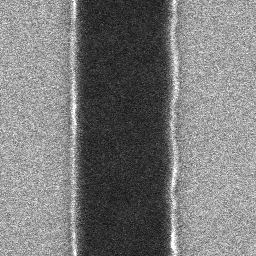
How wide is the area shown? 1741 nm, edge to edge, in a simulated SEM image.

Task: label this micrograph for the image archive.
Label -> one or a few lines or trenches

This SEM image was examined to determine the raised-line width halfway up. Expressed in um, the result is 0.708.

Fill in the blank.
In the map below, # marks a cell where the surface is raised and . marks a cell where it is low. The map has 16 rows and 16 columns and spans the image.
....#######.....
.....######.....
....#######.....
....#######.....
....#######.....
....#######.....
....#######.....
....#######.....
....#######.....
....#######.....
....#######.....
.....######.....
.....######.....
.....######.....
.....######.....
.....######.....